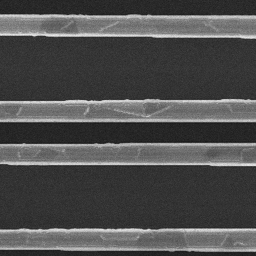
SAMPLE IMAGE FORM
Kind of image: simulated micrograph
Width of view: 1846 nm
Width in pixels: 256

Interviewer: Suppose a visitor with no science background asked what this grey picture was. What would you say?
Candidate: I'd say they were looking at lines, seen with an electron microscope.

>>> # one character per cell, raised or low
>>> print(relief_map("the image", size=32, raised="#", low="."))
................................
................................
################################
################################
....................############
................................
................................
................................
................................
................................
................................
................................
............................##..
################################
################################
................................
................................
................................
################################
################################
..##..##########################
................................
................................
................................
................................
................................
................................
................................
................................
################################
################################
................................